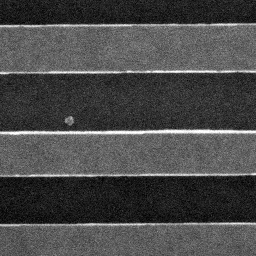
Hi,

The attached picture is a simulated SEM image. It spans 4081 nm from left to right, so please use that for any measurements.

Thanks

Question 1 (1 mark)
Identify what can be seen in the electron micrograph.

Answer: lines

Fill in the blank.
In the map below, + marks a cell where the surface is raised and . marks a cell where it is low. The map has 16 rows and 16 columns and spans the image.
................
................
++++++++++++++++
++++++++++++++++
++++++..........
................
................
................
++++++++++++++++
++++++++++++++++
++++++++++++++++
................
................
................
++++++++++++++++
++++++++++++++++